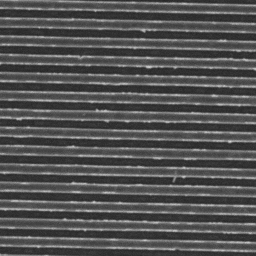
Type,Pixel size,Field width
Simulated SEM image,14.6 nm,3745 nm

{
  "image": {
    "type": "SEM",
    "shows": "parallel lines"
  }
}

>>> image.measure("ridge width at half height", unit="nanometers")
137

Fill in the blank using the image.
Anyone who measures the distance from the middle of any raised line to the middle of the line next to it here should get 267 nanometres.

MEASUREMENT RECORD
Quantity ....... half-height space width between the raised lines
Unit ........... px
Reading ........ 8.5